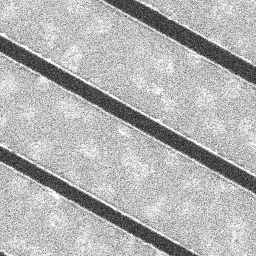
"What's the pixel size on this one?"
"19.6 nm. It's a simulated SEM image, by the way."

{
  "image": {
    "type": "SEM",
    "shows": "one or a few lines or trenches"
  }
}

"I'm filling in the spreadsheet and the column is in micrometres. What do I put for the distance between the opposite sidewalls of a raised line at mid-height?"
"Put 0.354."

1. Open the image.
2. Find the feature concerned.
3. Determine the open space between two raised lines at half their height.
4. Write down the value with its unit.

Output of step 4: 1.53 micrometres